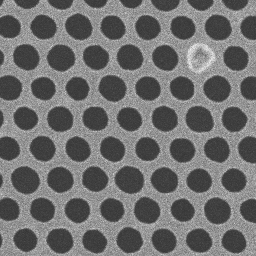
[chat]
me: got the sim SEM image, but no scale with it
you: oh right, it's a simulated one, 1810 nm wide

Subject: a regular array of holes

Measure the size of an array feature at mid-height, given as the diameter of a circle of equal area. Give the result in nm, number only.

181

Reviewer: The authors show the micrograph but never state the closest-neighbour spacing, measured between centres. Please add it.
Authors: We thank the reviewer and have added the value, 242 nanometers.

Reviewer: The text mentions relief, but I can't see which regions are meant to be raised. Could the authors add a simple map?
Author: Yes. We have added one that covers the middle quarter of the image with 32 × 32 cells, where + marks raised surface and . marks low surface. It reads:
..++++.....+++......+++.....++++
.++++++..++++++...+++++++..+++++
++++++++++++++++++++++++++++++++
++...++++.....+++++...++++++...+
+.....+++......+++......+++.....
......+++.......++......++......
.......++.......++......++......
+.....+++......+++......+++.....
++....++++.....++++....+++++....
++++++++++++.+++++++++++++++++++
++++++++++++++++++++++++++++++++
.++++.....++++....+++++....++++.
..+++......++......+++......+++.
..+++......++......+++.......+..
..+++......++.......++.......+..
..+++......+++.....+++......+++.
.++++++..++++++...++++++...+++++
++++++++++++++++++++++++++++++++
++...+++++...++++++...++++++++++
+.....+++.....++++.....++++.....
......+++......+++......++......
.......++......+++......++......
+......++......+++......+++.....
+.....++++.....++++....++++.....
+++.++++++++.+++++++++++++++...+
+++++++.+++++++..+++++++++++++++
.++++.....++++.....++++....+++++
..+++.....+++.......++......+++.
...+.......++.......++.......++.
...+.......++.......++.......+..
..+++......++.......++.......++.
.+++++....++++.....++++.....++++